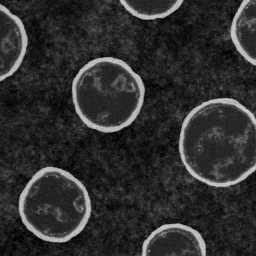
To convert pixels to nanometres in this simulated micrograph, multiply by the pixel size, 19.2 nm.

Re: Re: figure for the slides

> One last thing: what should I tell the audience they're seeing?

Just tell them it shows raised bodies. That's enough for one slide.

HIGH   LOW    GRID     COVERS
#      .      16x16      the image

........###....#
#..............#
##.............#
#..............#
#....###........
.....####.......
.....####....##.
.....###....####
...........#####
...........#####
............####
..###........#..
.####...........
.####...........
..###.....##....
.........####...